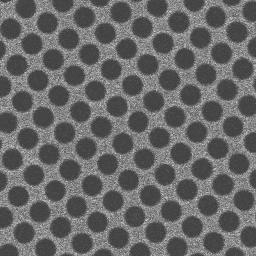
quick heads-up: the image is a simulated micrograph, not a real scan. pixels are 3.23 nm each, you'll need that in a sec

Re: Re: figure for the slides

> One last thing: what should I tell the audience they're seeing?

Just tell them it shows a regular array of holes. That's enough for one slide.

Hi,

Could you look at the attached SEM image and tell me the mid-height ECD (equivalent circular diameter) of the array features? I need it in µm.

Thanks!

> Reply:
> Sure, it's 0.0659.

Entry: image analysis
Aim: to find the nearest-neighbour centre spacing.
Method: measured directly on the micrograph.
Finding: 83.6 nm